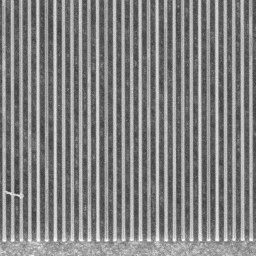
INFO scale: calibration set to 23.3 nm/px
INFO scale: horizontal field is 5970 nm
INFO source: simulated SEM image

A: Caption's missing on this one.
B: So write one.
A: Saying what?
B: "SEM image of parallel lines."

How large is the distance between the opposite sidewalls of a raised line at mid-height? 61.2 nm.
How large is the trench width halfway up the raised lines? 146 nm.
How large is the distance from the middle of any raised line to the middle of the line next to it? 198 nm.